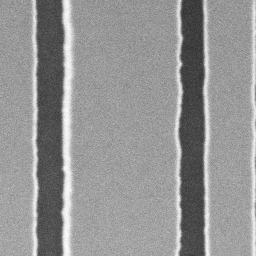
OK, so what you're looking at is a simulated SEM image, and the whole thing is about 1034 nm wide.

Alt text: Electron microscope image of lines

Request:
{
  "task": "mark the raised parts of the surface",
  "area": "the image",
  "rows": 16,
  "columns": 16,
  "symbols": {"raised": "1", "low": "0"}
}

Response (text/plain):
1100111111100111
1100111111100111
1100111111100111
1100111111100111
1100111111100111
1100111111100111
1100111111100111
1100111111100111
1100111111100111
1100111111100111
1100111111100111
1100111111100111
1100111111100111
1100111111100111
1100111111100111
1100111111100111